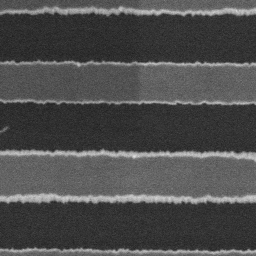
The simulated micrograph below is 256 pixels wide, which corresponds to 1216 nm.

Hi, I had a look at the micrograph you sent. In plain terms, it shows lines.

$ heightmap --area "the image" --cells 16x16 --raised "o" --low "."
oooooooooooooooo
................
................
................
oooooooooooooooo
oooooooooooooooo
..........o.oooo
................
................
oooo.oo.........
oooooooooooooooo
oooooooooooooooo
ooo.oooooooooooo
................
................
................